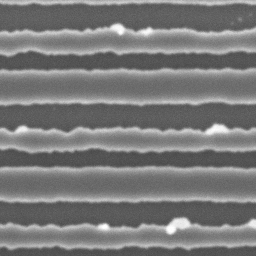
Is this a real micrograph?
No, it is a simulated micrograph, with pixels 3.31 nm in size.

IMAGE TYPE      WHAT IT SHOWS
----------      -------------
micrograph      lines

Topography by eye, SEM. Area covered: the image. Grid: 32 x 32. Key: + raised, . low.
..........................+.....
................................
................................
.............+++................
++++++++++++++++++++++++++++++++
++++++++++++++++++++++++++++++++
++...+++++++..++....++.+..++....
................................
................................
++++++++++++++++++++++++++++++++
++++++++++++++++++++++++++++++++
++++++++++++++++++++++++++++++++
++++++++++++++++++++++++++++++++
................................
................................
................................
++++++++.+++++++++++++++++++++++
++++++++++++++++++++++++++++++++
+.+++++++++..+++++++++++++++++++
................................
................................
++++++++++++++++++++++++++++++++
++++++++++++++++++++++++++++++++
++++++++++++++++++++++++++++++++
++++++++++++++++++++++++++++++++
................................
................................
......................+.........
++++++++++++++++.+++++++++++++++
++++++++++++++++++++++++++++++++
++++++++++++++++++++++++++++++++
................................